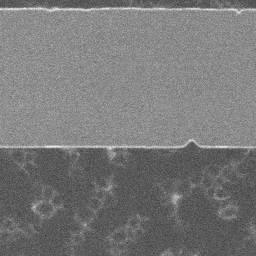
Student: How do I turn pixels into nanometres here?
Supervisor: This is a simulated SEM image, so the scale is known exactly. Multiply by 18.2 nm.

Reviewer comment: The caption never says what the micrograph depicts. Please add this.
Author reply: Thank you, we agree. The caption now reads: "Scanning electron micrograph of one or a few lines or trenches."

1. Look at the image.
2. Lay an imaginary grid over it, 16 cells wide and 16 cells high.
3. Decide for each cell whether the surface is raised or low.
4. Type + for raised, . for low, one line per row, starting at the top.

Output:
++++++++++++++++
................
................
................
................
................
................
................
................
++++++++++++++++
++++++++++++++++
++++++++++++++++
++++++++++++++++
++++++++++++++++
++++++++++++++++
++++++++++++++++